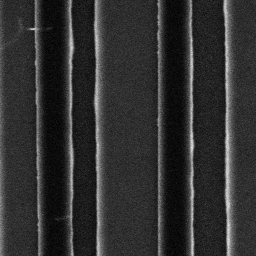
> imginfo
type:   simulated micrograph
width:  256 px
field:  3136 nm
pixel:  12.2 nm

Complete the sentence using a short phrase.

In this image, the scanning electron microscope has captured lines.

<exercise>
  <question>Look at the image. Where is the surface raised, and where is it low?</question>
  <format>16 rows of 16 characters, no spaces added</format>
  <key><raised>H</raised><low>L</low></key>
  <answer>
HHHHLLHHHHHHLLHH
HHHHLLHHHHHHLLHH
HHHHLLHHHHHHLLHH
HHHHLLHHHHHHLLHH
HHHHLLHHHHHHLLHH
HHHHLLHHHHHHLLHH
HHHHLLHHHHHHLLHH
HHHHLLHHHHHHLLHH
HHHHLLHHHHHHLLHH
HHHHLLHHHHHHLLHH
HHHHLLHHHHHHLLHH
HHHHLLHHHHHHLLHH
HHHHLLHHHHHHLLHH
HHHHLLHHHHHHLLHH
HHHHLLHHHHHHLLHH
HHHHHLHHHHHHLLHH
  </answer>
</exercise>